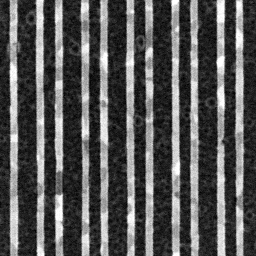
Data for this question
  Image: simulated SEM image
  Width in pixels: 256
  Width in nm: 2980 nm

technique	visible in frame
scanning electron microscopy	parallel lines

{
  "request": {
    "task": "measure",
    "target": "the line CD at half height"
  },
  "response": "6.13 pixels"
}